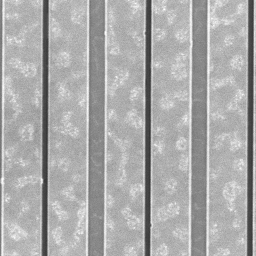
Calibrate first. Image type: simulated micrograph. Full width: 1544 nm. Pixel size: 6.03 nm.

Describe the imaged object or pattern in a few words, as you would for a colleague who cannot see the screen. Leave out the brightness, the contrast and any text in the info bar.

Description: parallel lines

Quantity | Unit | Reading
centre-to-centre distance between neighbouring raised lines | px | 51.3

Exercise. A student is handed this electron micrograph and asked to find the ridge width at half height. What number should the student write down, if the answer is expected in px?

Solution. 39.8